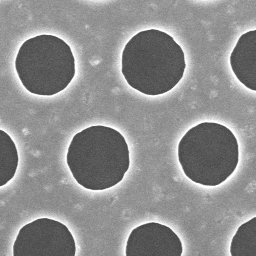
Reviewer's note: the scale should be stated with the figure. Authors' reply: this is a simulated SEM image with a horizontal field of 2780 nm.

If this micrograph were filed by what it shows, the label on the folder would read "holes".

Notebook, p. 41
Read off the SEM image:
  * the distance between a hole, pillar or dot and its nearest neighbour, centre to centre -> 1160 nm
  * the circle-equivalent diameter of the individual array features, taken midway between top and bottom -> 686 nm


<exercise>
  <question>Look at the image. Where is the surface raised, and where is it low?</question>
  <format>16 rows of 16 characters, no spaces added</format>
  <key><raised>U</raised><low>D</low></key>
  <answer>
UUUUUUUUUUUUUUUU
UUUUUUUUUUUUUUUU
UUDDUUUUDDDUUUUD
UDDDDUUUDDDUUUDD
UDDDDUUUDDDUUUUD
UUDDUUUUDDDUUUUU
UUUUUUUUUUUUUUUU
UUUUUUUUUUUUUUUU
DUUUUDDDUUUDDDDU
DUUUDDDDUUUDDDDU
DUUUDDDDUUUDDDDU
UUUUUDDUUUUUUDUU
UUUUUUUUUUUUUUUU
UUUUUUUUUUUUUUUU
UDDDUUUUDDDUUUUD
UDDDDUUUDDDUUUDD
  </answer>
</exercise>